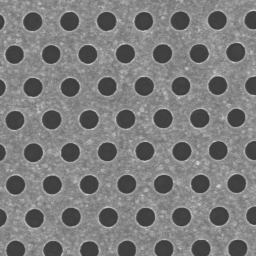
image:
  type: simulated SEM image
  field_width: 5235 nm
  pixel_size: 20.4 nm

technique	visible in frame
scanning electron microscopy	a regular array of holes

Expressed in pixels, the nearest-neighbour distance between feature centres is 36.7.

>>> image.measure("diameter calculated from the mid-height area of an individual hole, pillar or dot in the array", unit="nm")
392